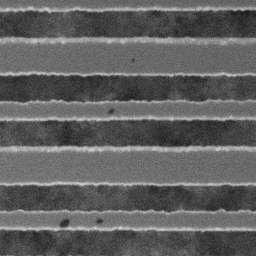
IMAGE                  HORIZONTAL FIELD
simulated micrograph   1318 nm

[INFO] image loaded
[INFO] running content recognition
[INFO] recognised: lines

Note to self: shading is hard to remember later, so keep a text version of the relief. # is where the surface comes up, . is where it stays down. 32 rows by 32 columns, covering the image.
################################
................................
................................
................................
................................
################################
################################
################################
################################
................................
................................
................................
................................
################################
################################
................................
................................
................................
................................
################################
################################
################################
################################
................................
................................
................................
############.#######..####.#####
################################
################################
................................
................................
................................